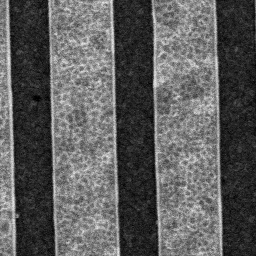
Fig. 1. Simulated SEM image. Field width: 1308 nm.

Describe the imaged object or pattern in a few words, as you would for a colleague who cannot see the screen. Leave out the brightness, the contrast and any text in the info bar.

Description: one or a few lines or trenches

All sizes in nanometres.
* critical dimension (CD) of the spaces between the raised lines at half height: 213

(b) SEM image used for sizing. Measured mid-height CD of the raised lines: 318 nm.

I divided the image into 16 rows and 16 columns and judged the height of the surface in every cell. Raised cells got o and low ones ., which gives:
...oooo...ooo...
...oooo...ooo...
o..oooo...ooo...
o..oooo...ooo...
o..oooo...oooo..
o..oooo...oooo..
o..oooo...oooo..
o..oooo...oooo..
o..oooo...oooo..
o..oooo...oooo..
o..oooo...oooo..
o..oooo...oooo..
o..oooo...oooo..
o..oooo...oooo..
o..oooo...oooo..
o...ooo...oooo..